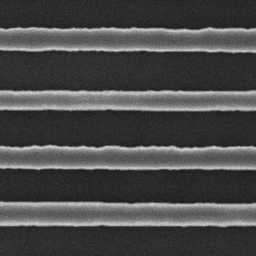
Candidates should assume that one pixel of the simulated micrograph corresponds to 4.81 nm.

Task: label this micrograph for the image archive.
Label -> lines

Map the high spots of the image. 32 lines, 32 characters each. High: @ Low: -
--------------------------------
--------------------------------
--------------------------------
--@@@@--------------------@-----
@@@@@@@@@@@@@@@@@@@@@@@@@@@@@@@@
@@@@@@@@@@@@@@@@@@@@@@@@@@@@@@@@
--------------------------------
--------------------------------
--------------------------------
--------------------------------
--------------------------------
@@@@@@@@@@@@@@@@@@@@@@@@@@@@@@@@
@@@@@@@@@@@@@@@@@@@@@@@@@@@@@@@@
@@@@@@@@@@@@@@@@@@@@@@@@@@@@@@@@
--------------------------------
--------------------------------
--------------------------------
--------------------------------
@@@@@@@@@@@@@@@@@@@@@@@@@@@@@@@@
@@@@@@@@@@@@@@@@@@@@@@@@@@@@@@@@
@@@@@@@@@@@@@@@@@@@@@@@@@@@@@@@@
--------------------------------
--------------------------------
--------------------------------
--------------------------------
@@@@@@@@@@@@@@@@-@@@@---@@@----@
@@@@@@@@@@@@@@@@@@@@@@@@@@@@@@@@
@@@@@@@@@@@@@@@@@@@@@@@@@@@@@@@@
--------------------------------
--------------------------------
--------------------------------
--------------------------------